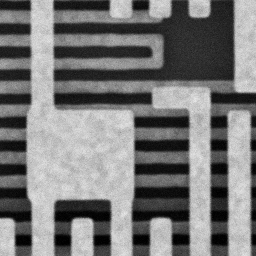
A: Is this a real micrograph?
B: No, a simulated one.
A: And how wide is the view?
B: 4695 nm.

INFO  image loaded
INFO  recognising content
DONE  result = wiring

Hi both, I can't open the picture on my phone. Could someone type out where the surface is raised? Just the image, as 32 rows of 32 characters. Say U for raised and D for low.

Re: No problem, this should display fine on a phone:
DDDDUUUDDDDDDDUUDDDUUDDDUUDDDUUU
DDDDUUUDDDDDDDUUDDDUUDDDUUDDDUUU
DDDDUUUDDDDDDDDDDDDDDDDDDDDDDUUU
DDDDUUUDDDDDDDDDDDDDDDDDDDDDDUUU
DDDDUUUDDDDDDDDDDDDDDDDDDDDDDUUU
DDDDUUUDDDDDDDDDDDDDDDDDDDDDDUUU
DDDDUUUDDDDDDDDDDDDDDDDDDDDDDUUU
DDDDUUUDDDDDDDDDDDDDDDDDDDDDDUUU
DDDDUUUDDDDDDDDDDDDDDDDDDDDDDUUU
DDDDUUUDDDDDDDDDDDDDDDDDDDDDDUUU
DDDDUUUDDDDDDDDDDDDDDDDDDDDDDUUU
DDDDUUUDDDDDDDDDDDDUUUUUUUDDDDDD
DDDDUUUDDDDDDDDDDDDUUUUUUUDDDDDD
DDDDUUUDDDDDDDDDDDDDDDDUUUDDDDDD
DDDUUUUUUUUUUUUUUDDDDDDDUUDDDUUD
DDDUUUUUUUUUUUUUUDDDDDDDUUDDDUUD
DDDUUUUUUUUUUUUUUDDDDDDDUUDDDUUD
DDDUUUUUUUUUUUUUUDDDDDDDUUDDDUUD
DDDUUUUUUUUUUUUUUDDDDDDDUUDDDUUD
DDDUUUUUUUUUUUUUUDDDDDDDUUDDDUUD
DDDUUUUUUUUUUUUUUDDDDDDDUUDDDUUD
DDDUUUUUUUUUUUUUUDDDDDDDUUDDDUUD
DDDUUUUUUUUUUUUUUDDDDDDDUUDDDUUD
DDDUUUUUUUUUUUUUUDDDDDDDUUDDDUUD
DDDUUUUUUUUUUUUUUDDDDDDDUUDDDUUD
DDDDUUUDDDDDDDUUUDDDDDDDUUDDDUUD
DDDDUUUDDDDDDDUUDDDDDDDDUUDDDUUD
UDDDUUUDDUUDDDUUDDDUUDDDUUDDDUUD
UUDDUUUDDUUUDDUUDDDUUDDDUUDDDUUD
UUDDUUUDDUUUDDUUDDDUUDDDUUDDDUUD
UUDDUUUDDUUUDDUUDDDUUDDDUUDDDUUD
UUDDUUUDDUUUDDUUDDDUUDDDUUDDDUUD